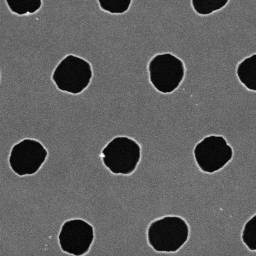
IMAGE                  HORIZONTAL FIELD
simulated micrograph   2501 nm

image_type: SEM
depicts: holes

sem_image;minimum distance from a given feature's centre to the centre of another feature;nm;902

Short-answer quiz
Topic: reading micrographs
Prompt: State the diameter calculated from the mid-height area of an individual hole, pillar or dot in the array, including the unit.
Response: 352 nanometers